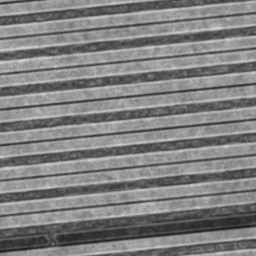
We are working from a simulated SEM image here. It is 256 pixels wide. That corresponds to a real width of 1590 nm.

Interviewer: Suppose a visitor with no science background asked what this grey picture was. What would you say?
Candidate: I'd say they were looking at parallel lines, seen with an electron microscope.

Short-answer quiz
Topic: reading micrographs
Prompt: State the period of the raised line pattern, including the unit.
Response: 108 nm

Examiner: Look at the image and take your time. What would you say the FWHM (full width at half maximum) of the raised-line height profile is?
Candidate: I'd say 0.0633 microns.